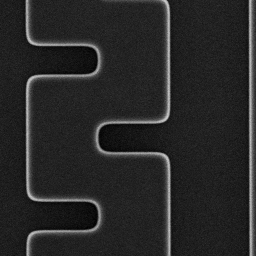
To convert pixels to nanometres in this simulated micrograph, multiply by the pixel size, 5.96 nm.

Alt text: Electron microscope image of groups of lines, slits or small figures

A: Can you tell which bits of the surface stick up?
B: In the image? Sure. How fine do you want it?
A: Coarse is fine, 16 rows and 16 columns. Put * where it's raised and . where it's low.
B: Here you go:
..*********.....
..*********.....
..*********.....
......*****.....
......*****.....
..*********.....
..*********.....
..********......
..****..........
..*****.........
..*********.....
..*********.....
..*********.....
......*****.....
..*********.....
..*********.....